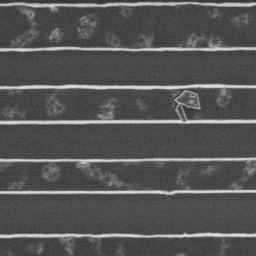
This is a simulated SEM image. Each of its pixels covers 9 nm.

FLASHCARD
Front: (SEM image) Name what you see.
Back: one or a few lines or trenches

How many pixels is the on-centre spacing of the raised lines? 74.5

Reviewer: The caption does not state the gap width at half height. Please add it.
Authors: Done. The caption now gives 0.344 um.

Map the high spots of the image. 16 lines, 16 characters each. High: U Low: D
UUUUUUUUUUUUUUUU
UUUUUUUUUUUUUUUU
UUUUUUUUUUUUUUUU
DDDDDDDDDDDDDDDD
DDDDDDDDDDDDDDDD
UUUUUUUUUUUUUUUU
UUUUUUUUUUUUUUUU
UUUUUUUUUUUUUUUU
DDDDDDDDDDDDDDDD
DDDDDDDDDDDDDDDD
UUUUUUUUUUUUUUUU
UUUUUUUUUUUUUUUU
DDDDDDDDDDDDDDDD
DDDDDDDDDDDDDDDD
DDDDDDDDDDDDDDDD
UUUUUUUUUUUUUUUU